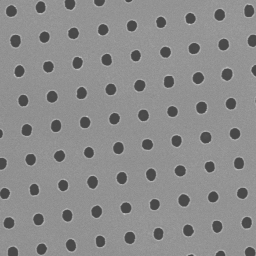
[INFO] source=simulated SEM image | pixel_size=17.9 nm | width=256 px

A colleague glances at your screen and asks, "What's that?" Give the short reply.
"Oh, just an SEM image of a regular array of holes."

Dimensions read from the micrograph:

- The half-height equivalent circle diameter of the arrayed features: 199 nanometres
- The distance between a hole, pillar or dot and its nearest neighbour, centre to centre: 524 nanometres